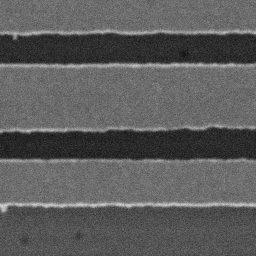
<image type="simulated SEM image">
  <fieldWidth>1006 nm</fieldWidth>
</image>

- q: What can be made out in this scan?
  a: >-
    lines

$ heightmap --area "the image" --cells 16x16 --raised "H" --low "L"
HHHHHHHHHHHHHHHH
HHHHHHHHHHHHHHHH
LLLLLLLLLLLLLLLL
LLLLLLLLLLLLLLLL
HHHHHHHHHHHHHHHH
HHHHHHHHHHHHHHHH
HHHHHHHHHHHHHHHH
HHHHHHHHHHHHHHHH
LLLLLLLLLLLLLLLL
LLLLLLLLLLLLLLLL
HHHHHHHHHHHHHHHH
HHHHHHHHHHHHHHHH
HHHHHHHHHHHHHHHH
LLLLLLLLLLLLLLLL
LLLLLLLLLLLLLLLL
LLLLLLLLLLLLLLLL